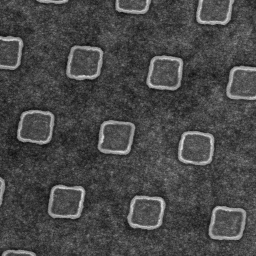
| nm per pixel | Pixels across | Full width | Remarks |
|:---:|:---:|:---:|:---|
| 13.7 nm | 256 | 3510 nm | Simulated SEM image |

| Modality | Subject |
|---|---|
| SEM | a regular array of raised bodies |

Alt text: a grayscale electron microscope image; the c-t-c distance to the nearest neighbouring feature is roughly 1110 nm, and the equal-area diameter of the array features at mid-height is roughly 475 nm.